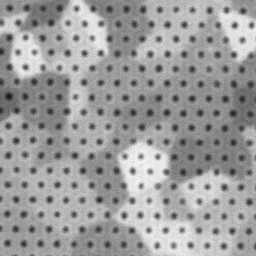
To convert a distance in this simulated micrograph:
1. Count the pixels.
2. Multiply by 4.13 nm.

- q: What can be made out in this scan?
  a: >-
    a regular array of holes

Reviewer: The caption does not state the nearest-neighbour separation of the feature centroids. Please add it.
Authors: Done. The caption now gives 0.0677 µm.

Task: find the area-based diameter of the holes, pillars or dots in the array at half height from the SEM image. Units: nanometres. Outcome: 34.9